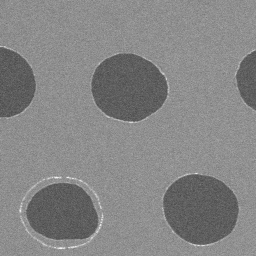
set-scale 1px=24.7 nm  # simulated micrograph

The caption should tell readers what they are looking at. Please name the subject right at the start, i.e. raised bodies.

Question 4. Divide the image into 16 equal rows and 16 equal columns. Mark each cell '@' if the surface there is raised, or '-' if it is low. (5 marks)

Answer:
----------------
----------------
----------------
@------@@------@
@@----@@@@-----@
@@----@@@@-----@
@@----@@@@-----@
-------@@-------
----------------
----------------
----------------
---@@------@@@--
--@@@@----@@@@@-
--@@@@----@@@@@-
--@@@@-----@@@--
----------------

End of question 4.